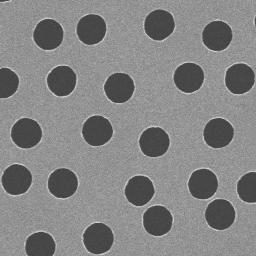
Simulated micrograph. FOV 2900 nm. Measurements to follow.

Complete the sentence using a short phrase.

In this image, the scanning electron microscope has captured a regular array of holes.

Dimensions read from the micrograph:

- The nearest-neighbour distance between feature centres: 546 nanometres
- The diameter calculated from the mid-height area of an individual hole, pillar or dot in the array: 344 nanometers